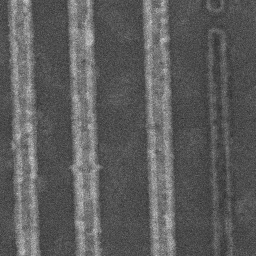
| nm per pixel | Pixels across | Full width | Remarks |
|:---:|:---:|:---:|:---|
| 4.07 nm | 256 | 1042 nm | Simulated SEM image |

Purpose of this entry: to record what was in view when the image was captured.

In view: one or a few lines or trenches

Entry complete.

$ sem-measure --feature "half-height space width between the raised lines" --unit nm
185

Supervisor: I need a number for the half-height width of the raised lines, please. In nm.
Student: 64.1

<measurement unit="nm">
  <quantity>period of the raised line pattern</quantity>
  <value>266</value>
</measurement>